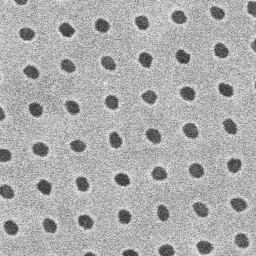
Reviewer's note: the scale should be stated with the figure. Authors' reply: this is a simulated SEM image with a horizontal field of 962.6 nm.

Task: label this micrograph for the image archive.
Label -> a regular array of holes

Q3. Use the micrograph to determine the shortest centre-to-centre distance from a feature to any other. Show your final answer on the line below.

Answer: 140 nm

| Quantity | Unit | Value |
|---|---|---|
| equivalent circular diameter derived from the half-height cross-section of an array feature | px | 14.6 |